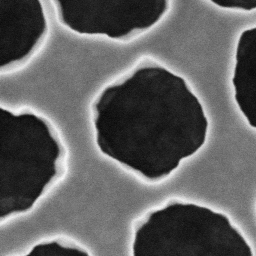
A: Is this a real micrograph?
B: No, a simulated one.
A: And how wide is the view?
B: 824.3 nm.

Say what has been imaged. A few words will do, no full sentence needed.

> holes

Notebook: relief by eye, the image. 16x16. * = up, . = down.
...*......*****.
...*......******
...************.
..*************.
********...****.
*******.....***.
******......***.
...***.......***
...***.......***
....***.....****
....****...*****
...*************
..**************
.********.....**
*********......*
**...***........